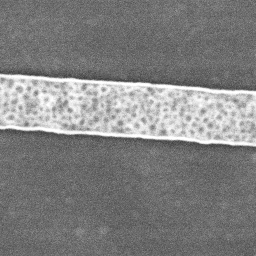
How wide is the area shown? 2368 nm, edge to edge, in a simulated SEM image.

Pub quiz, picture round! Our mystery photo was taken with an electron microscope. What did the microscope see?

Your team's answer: one or a few lines or trenches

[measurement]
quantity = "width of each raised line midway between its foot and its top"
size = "480 nanometres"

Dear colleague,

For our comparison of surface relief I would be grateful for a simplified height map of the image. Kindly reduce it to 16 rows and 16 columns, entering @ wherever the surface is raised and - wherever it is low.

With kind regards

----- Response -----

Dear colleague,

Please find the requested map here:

----------------
----------------
----------------
----------------
----------------
@@@@@@@@@@@@----
@@@@@@@@@@@@@@@@
@@@@@@@@@@@@@@@@
---------@@@@@@@
----------------
----------------
----------------
----------------
----------------
----------------
----------------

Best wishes